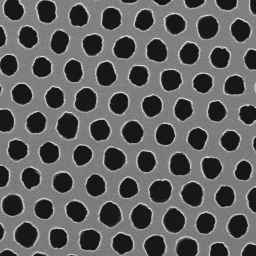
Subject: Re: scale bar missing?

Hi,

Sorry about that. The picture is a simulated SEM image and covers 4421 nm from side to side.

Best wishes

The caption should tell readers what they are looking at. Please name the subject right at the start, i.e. a regular array of holes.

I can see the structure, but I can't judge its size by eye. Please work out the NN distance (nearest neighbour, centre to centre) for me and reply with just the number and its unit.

544 nanometres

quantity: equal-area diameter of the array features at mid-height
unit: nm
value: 344